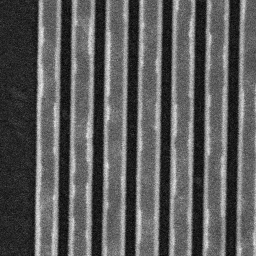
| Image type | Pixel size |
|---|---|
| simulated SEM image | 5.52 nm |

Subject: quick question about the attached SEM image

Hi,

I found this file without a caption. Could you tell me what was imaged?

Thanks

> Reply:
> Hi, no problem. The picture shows parallel lines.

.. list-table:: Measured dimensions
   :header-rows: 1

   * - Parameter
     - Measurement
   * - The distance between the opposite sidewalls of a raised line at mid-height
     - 108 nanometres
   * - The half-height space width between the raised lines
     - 77.2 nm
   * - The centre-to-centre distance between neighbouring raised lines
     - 0.185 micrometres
